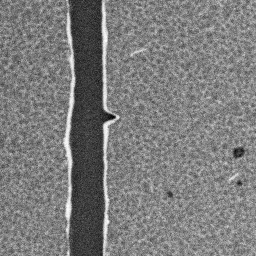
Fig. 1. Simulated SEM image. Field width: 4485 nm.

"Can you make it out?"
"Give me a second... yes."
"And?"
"one or a few lines or trenches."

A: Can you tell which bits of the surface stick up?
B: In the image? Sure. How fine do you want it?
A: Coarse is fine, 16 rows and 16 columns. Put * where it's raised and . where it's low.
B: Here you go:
****..**********
****...*********
****...*********
****...*********
*****..*********
*****..*********
****...*********
****...*********
****...*********
****...*********
****...*********
****...*********
****...*********
****...*********
****...*********
****..**********